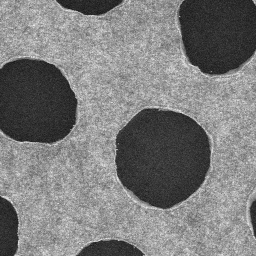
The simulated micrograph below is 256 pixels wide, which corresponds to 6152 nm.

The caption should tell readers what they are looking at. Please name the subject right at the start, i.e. holes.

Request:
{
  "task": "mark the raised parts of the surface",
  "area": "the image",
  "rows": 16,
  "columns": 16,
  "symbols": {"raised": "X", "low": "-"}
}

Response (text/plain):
XXXX---XXXX-----
XXXXXXXXXXX-----
XXXXXXXXXXX-----
XXXXXXXXXXXX----
----XXXXXXXXX--X
----XXXXXXXXXXXX
-----XXXXXXXXXXX
-----XXX----XXXX
----XXX------XXX
XXXXXXX------XXX
XXXXXXX------XXX
XXXXXXXX-----XXX
XXXXXXXXX---XXXX
-XXXXXXXXXXXXXXX
-XXXXXXXXXXXXXXX
-XXXX----XXXXXXX